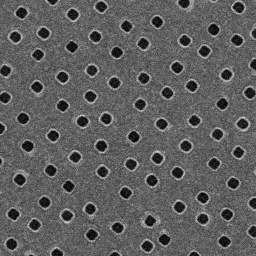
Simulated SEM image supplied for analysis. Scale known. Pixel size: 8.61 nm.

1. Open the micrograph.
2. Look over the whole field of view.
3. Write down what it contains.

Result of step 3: a regular array of holes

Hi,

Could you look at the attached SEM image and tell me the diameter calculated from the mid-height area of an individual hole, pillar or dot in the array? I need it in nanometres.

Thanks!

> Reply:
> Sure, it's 101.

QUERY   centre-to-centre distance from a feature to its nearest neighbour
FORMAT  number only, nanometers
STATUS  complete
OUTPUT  220